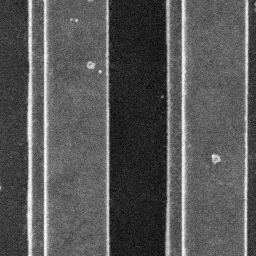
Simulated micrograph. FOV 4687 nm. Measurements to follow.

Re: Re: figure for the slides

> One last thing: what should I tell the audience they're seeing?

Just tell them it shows lines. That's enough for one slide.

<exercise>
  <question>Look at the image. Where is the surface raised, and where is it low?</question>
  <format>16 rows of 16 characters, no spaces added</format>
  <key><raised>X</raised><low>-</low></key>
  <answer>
--XXXXX----XXXX-
--XXXXX----XXXX-
--XXXXX----XXXX-
--XXXXX----XXXX-
--XXXXX----XXXX-
--XXXXX----XXXX-
--XXXXX----XXXX-
--XXXXX----XXXX-
--XXXXX----XXXX-
--XXXXX----XXXX-
--XXXXX----XXXX-
--XXXXX----XXXX-
--XXXXX----XXXX-
--XXXXX----XXXX-
--XXXXX----XXXX-
--XXXXX----XXXX-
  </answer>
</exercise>